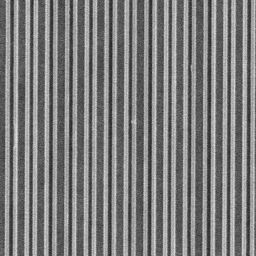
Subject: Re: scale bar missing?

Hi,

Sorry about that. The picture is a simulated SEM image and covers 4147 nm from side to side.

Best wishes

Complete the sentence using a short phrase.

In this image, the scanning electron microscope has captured parallel lines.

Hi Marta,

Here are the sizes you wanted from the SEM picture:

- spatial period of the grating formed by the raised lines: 159 nm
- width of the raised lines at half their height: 54.7 nanometres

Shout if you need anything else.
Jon